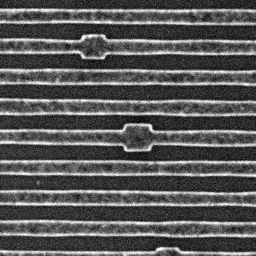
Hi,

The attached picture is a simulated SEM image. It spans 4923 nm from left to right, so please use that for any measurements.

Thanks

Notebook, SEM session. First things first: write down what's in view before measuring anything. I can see wiring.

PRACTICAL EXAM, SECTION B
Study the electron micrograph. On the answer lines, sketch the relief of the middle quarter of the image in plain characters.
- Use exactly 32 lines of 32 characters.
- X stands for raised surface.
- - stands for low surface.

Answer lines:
--------------------------------
--------------------------------
XXXXXXXXXXXXXXXXXXXXXXXXXXXXXXXX
XXXXXXXXXXXXXXXXXXXXXXXXXXXXXXXX
XXXXXXXXXXXXXXXXXXXXXXXXXXXXXXXX
--------------------------------
--------------------------------
--------------------------------
--------------------------------
XXXXXXXXXXXXXXXXXXXXXXXXXXXXXXXX
XXXXXXXXXXXXXXXXXXXXXXXXXXXXXXXX
XXXXXXXXXXXXXXXXXXXXXXXXXXXXXXXX
-----------------XXX----XXXXXXXX
--------------------------------
--------------------------------
---------------XXXXXXX----------
--------------XXXXXXXX----------
XXXXXXXXXXXXXXXXXXXXXXXXXXXXXXXX
XXXXXXXXXXXXXXXXXXXXXXXXXXXXXXXX
XXXXXXXXXXXXXXXXXXXXXXXXXXXXXXXX
---------------XXXXXXX----------
---------------XXXXXX-----------
--------------------------------
--------------------------------
XXXXXXXXXXXXXXXXXX-------------X
XXXXXXXXXXXXXXXXXXXXXXXXXXXXXXXX
XXXXXXXXXXXXXXXXXXXXXXXXXXXXXXXX
XXXXXXXXXXXXXXXXXXXXXXXXXXXXXXXX
--------------------------------
--------------------------------
--------------------------------
--------------------------------